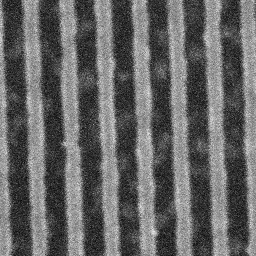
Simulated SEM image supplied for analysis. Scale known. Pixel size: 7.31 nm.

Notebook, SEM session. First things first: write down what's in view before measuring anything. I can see parallel lines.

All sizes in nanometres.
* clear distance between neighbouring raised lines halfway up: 169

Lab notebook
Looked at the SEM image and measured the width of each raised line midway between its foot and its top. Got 94.1 nm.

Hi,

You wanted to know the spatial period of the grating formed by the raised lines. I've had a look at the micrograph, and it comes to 264 nm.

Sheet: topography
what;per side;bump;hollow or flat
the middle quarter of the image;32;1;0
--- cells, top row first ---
11100000011100000011100000011100
11100000011100000011100000011100
11100000011100000011100000011100
11100000011100000011100000011100
11100000011100000011100000011100
11100000011100000011100000011100
11100000011100000011100000011100
11100000011100000011100000011100
11100000011100000011110000011100
11100000011100000011110000011100
11100000011100000011100000011100
11100000011100000011100000011100
11100000011100000011100000011100
11100000011100000011100000011100
11110000011100000001100000001110
11110000001100000001100000001110
11100000001100000001100000001110
11100000011100000001100000001100
01100000011110000001100000001100
11100000011110000001110000001100
11100000001110000011110000001110
01110000001110000011110000001110
01110000001110000011110000001110
01110000001110000001110000001110
01110000001110000001110000001110
01110000001110000001110000001110
01110000001110000001110000001110
01110000001110000001110000001110
01110000001110000001110000001110
01110000001110000001110000001110
01110000001110000001110000001110
01110000001110000001110000001110